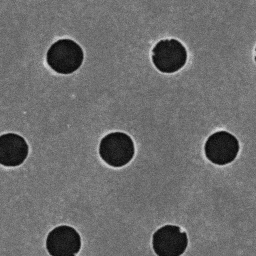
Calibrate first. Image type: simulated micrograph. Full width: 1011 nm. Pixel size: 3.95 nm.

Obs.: holes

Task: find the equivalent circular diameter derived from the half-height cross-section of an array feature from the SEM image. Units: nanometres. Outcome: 143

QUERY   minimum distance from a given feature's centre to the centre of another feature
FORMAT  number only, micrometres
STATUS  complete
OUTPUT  0.412